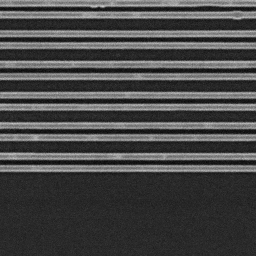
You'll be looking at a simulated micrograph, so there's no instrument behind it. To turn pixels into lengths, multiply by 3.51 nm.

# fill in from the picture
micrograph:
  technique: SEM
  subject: parallel lines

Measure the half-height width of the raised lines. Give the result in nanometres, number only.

20.6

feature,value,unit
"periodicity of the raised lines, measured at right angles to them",53.8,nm